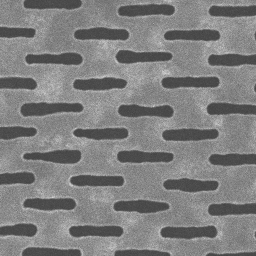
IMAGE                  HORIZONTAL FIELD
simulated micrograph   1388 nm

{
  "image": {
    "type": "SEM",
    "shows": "a regular array of holes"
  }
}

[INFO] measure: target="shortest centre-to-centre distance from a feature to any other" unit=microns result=0.257